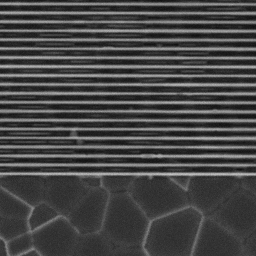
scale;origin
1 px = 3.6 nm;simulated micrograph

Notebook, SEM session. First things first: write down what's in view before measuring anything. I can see parallel lines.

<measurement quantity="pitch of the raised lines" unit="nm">32.2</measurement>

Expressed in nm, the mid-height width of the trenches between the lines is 24.8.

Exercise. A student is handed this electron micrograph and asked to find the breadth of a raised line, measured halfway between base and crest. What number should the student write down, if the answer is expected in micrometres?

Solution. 0.009